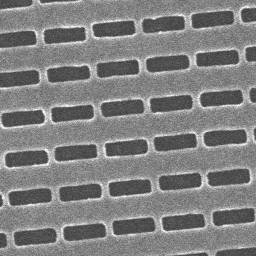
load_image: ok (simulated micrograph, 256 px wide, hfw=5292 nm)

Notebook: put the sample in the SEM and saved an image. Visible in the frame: a regular array of holes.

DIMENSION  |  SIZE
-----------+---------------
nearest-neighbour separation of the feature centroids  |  814 nanometers